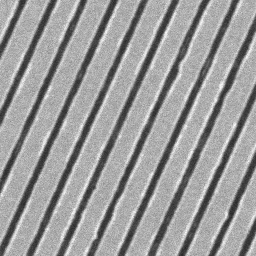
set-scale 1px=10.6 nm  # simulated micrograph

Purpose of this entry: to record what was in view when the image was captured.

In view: parallel lines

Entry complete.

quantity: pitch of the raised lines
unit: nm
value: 293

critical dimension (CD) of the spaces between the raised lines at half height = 91.7 nanometres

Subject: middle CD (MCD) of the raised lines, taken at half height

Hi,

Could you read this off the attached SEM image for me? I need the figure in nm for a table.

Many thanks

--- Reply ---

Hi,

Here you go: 205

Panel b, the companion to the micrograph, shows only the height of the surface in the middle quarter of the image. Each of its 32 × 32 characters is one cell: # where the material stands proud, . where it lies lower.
####..######..#####...#####..###
####..#####...#####..#####...###
###...#####..#####...#####...###
###..#####...#####..#####...####
##...#####..#####...#####...####
##..#####...#####..#####...#####
#...#####..#####...#####...#####
#..#####...#####..######..#####.
#..#####..######..#####...#####.
..######..#####..######..#####..
..#####...#####..######..#####..
.######..#####...#####..#####...
.#####...#####..#####...#####..#
.#####..#####...#####..#####...#
#####...#####..#####...#####...#
#####..#####...#####..######..##
####...#####...#####..#####...##
####..#####...#####..######..###
###...#####...#####..#####...###
###..#####...#####...#####..####
###..#####...#####..#####...####
##...#####..#####...#####..#####
##..#####...#####..######..#####
#...#####..######..#####..#####.
#..#####...#####..######..#####.
...#####...####...#####...#####.
..#####...#####...#####..#####..
..#####..######..#####...#####..
.######..#####..######..#####...
.#####...#####..#####...#####..#
######..#####...#####..#####...#
#####...#####..######..#####..##